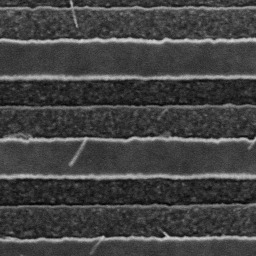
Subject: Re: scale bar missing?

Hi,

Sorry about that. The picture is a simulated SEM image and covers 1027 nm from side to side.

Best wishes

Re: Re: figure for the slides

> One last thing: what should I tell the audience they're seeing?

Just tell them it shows lines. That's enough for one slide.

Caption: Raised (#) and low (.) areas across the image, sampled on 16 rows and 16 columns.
................
................
#.##############
################
################
................
................
................
................
################
################
................
................
................
................
################